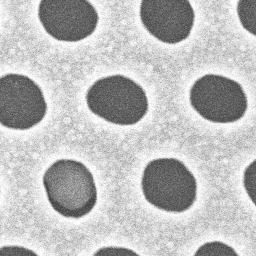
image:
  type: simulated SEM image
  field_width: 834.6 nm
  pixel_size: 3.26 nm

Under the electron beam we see holes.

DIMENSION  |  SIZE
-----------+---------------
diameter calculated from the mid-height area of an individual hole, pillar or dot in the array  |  180 nm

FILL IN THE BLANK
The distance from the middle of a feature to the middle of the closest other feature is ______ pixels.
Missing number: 99.1